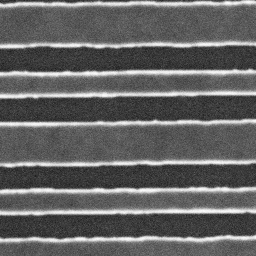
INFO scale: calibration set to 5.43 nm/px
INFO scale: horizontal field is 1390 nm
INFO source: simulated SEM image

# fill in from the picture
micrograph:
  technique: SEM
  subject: lines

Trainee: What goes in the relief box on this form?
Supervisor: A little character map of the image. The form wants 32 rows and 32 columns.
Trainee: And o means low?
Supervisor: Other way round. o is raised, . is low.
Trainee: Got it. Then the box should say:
..oooooooooooooooooooooooooooooo
oooooooooooooooooooooooooooooooo
oooooooooooooooooooooooooooooooo
oooooooooooooooooooooooooooooooo
oooooooooooooooooooooooooooooooo
oooooooooooooooooooooooooooooooo
................................
................................
................................
oooooooooooooooooooooooooooooooo
oooooooooooooooooooooooooooooooo
oooooooooooooooooooooooooooooooo
................................
................................
................................
oooooooooooooooooooooooooooooooo
oooooooooooooooooooooooooooooooo
oooooooooooooooooooooooooooooooo
oooooooooooooooooooooooooooooooo
oooooooooooooooooooooooooooooooo
ooooooooooooooooo.ooo...........
................................
................................
................................
oooooooooooooooooooooooooooooooo
oooooooooooooooooooooooooooooooo
oooooooooooooooooooooooooooooooo
................................
................................
................................
oooooooooooooooooooooooooooooooo
oooooooooooooooooooooooooooooooo